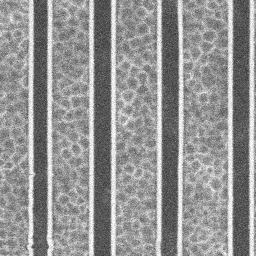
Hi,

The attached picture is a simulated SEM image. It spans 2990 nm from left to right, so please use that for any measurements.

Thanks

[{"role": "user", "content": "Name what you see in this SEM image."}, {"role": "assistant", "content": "one or a few lines or trenches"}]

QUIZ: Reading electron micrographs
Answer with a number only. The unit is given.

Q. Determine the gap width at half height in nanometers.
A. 533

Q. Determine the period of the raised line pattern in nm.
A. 781